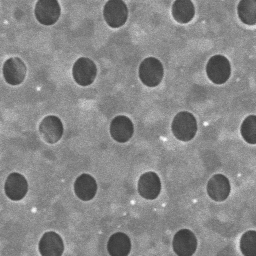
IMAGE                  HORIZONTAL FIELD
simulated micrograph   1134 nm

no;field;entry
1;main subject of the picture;a regular array of holes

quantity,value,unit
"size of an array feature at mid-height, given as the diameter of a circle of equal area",118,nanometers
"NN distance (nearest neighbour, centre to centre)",295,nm